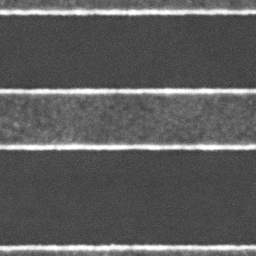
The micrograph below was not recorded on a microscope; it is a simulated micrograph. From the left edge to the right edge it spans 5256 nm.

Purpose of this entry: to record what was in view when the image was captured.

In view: one or a few lines or trenches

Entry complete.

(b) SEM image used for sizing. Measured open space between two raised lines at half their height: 1.84 micrometres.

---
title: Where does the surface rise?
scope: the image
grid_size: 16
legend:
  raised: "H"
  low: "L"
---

HHHHHHHHHHHHHHHH
LLLLLLLLLLLLLLLL
LLLLLLLLLLLLLLLL
LLLLLLLLLLLLLLLL
LLLLLLLLLLLLLLLL
LLLLLLLLLLLLLLLL
HHHHHHHHHHHHHHHH
HHHHHHHHHHHHHHHH
HHHHHHHHHHHHHHHH
LLLLLLLLLLLLLLLL
LLLLLLLLLLLLLLLL
LLLLLLLLLLLLLLLL
LLLLLLLLLLLLLLLL
LLLLLLLLLLLLLLLL
LLLLLLLLLLLLLLLL
HHHHHHHHHHHHHHHH